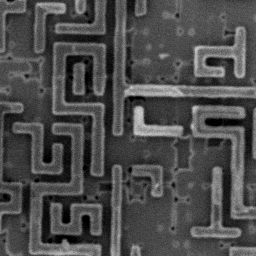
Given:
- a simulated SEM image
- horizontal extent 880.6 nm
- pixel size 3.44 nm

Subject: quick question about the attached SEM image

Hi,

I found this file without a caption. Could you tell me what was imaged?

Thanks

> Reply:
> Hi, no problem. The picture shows wiring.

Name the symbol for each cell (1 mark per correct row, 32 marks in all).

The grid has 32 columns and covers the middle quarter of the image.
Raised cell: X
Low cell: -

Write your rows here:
--XXX---XX---XX-----------------
--XXX--XXX---XX-----------------
--XXX--XXX---XX-----------------
--XXX--XXX---XX-----------------
--XXX--XXX---XX-----------------
--XXX---XX---XXXXXXXXXXXXX------
--XXX---XX---XXXXXXXXXXXXXXXXXXX
--------X----XXXXXXXXXXXXXXXXXXX
-------------XX-----------------
-------------XX-----------------
XXXXXXXXXX---XX-----------------
XXXXXXXXXX---XX---XX------------
------XXXX---XX---XX------------
-------XXX---X----XX------------
-------XXX---X----XX------------
XXXXX--XXX--XX----XXX-----------
XXXXX--XXX--XXX---XXXXXXXXXXXX--
-XXXX--XXX---X-----XXXXXXXXXXX--
--XXX--XXX----------------------
--XXX--XXX----------------------
--XXX--XXX----------------------
--XXX--XXX----------------------
--XXX--XXX----------------------
--XXX--XXX----------------------
--XXX--XXX----------------------
--XXX--XXX---------XXX----------
--XXX--XXX--XX---XXXXXXX--------
--XXX--XXX--XX---XXXXXXX--------
--XXX-------XX--------XX--------
--XXX-------XX--------XX--------
XXXX--------XX--------XX--------
XXXX--------XX--------XXX-------